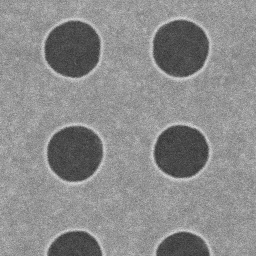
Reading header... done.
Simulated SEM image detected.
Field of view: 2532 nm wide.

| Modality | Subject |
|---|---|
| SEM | holes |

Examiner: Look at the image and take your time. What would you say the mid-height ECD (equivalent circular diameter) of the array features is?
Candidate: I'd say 565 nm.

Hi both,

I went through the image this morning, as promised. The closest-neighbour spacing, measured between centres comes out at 1020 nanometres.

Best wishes